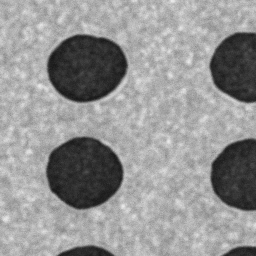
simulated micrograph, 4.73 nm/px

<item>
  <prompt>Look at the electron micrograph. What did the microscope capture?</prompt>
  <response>holes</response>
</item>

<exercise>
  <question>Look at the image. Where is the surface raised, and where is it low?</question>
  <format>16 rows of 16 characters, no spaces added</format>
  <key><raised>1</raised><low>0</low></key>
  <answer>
1111111111111111
1111111111111111
1111000111111100
1110000011111000
1110000011111000
1110000111111100
1111111111111111
1111111111111111
1111111111111111
1110000111111100
1110000011111000
1110000011111000
1111000111111100
1111111111111111
1111111111111111
1111101111111110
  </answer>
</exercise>